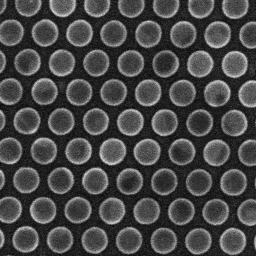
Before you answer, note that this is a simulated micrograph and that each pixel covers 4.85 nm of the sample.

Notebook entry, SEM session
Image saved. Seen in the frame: a regular array of raised bodies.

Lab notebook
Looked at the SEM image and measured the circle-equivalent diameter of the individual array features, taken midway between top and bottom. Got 124 nanometers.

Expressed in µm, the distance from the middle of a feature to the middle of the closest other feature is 0.165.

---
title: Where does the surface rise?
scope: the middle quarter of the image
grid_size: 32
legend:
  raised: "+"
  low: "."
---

++...++++++...++++++..++++++...+
++...++++++...+++++....+++++...+
+.....+++......+++.....++++.....
................................
..+++......+++......+++.....+++.
.++++++...+++++...++++++...+++++
.++++++..++++++...++++++...+++++
.++++++..++++++...++++++...+++++
.+++++....+++++...++++++...+++++
..++++....++++.....++++....+++++
................................
+......++.......++..............
++....++++....+++++....+++++....
++...++++++...+++++...++++++...+
++...++++++..+++++++..++++++...+
++...++++++...+++++...++++++...+
+.....++++....+++++....+++++...+
.......+........++......++......
................................
..++++....++++.....++++.....++++
.++++++...+++++...++++++...+++++
.++++++..++++++...++++++..++++++
.++++++..++++++...++++++..++++++
.+++++...++++++...+++++....+++++
..+++.....++++.....++++....++++.
................................
+......++......+++......++......
++...+++++....+++++....++++....+
++...++++++..++++++...++++++...+
++...++++++..+++++++..++++++...+
++...++++++..++++++...++++++...+
+.....++++....+++++....++++....+